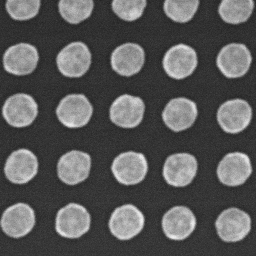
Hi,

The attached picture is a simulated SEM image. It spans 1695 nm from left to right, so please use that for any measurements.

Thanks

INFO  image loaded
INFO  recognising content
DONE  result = a regular array of raised bodies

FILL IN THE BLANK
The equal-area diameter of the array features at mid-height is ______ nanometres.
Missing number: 215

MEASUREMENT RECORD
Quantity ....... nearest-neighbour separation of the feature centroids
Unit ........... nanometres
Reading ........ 348